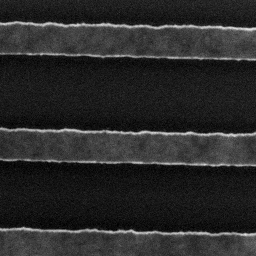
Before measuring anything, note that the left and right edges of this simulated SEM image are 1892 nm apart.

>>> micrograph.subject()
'lines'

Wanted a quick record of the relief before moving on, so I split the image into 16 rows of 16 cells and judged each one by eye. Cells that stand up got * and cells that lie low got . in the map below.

................
****.**.........
****************
......**********
................
................
................
................
****************
****************
................
................
................
................
**********......
****************